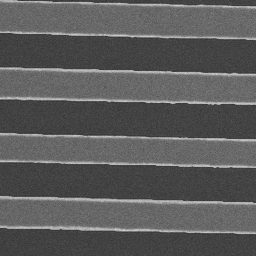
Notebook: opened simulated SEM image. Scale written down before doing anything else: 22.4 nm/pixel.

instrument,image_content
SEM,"lines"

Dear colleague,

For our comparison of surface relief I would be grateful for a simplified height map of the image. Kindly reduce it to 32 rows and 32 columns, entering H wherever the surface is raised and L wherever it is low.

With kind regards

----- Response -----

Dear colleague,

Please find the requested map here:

HHHHHHHHHHHHHHHHLLLLLLLLLLLLLLLL
HHHHHHHHHHHHHHHHHHHHHHHHHHHHHHHH
HHHHHHHHHHHHHHHHHHHHHHHHHHHHHHHH
HHHHHHHHHHHHHHHHHHHHHHHHHHHHHHHH
LLLLLLLLLLLLLHHHHHHHHHHHHHHHHHHH
LLLLLLLLLLLLLLLLLLLLLLLLLLLLLLLL
LLLLLLLLLLLLLLLLLLLLLLLLLLLLLLLL
LLLLLLLLLLLLLLLLLLLLLLLLLLLLLLLL
LLLLLLLLLLLLLLLLLLLLLLLLLLLLLLLL
HHHHHHHHHHHHHHHHHHHHHHHHHHHHHHHH
HHHHHHHHHHHHHHHHHHHHHHHHHHHHHHHH
HHHHHHHHHHHHHHHHHHHHHHHHHHHHHHHH
LLLLLLLLHHHHHHHHHHHHHHHHHHHHHHHH
LLLLLLLLLLLLLLLLLLLLLLLLLLLLLLLL
LLLLLLLLLLLLLLLLLLLLLLLLLLLLLLLL
LLLLLLLLLLLLLLLLLLLLLLLLLLLLLLLL
LLLLLLLLLLLLLLLLLLLLLLLLLLLLLLLL
HHHHHHHHHHHHHHHHHHHHHHHHHHHHHHHH
HHHHHHHHHHHHHHHHHHHHHHHHHHHHHHHH
HHHHHHHHHHHHHHHHHHHHHHHHHHHHHHHH
LLLLLLLLLLLLLHHHHHHHHHHHHHHHHHHH
LLLLLLLLLLLLLLLLLLLLLLLLLLLLLLLL
LLLLLLLLLLLLLLLLLLLLLLLLLLLLLLLL
LLLLLLLLLLLLLLLLLLLLLLLLLLLLLLLL
LLLLLLLLLLLLLLLLLLLLLLLLLLLLLLLL
HHHHHHHHHHHHHHHHHHHHHHHHHHHHHHHH
HHHHHHHHHHHHHHHHHHHHHHHHHHHHHHHH
HHHHHHHHHHHHHHHHHHHHHHHHHHHHHHHH
LHHHHHHHHHHHHHHHHHHHHHHHHHHHHHHH
LLLLLLLLLLLLLLLLLLLLLLLLLLLLLLLL
LLLLLLLLLLLLLLLLLLLLLLLLLLLLLLLL
LLLLLLLLLLLLLLLLLLLLLLLLLLLLLLLL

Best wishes